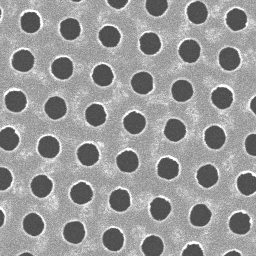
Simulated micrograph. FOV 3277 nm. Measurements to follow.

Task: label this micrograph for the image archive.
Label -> a regular array of holes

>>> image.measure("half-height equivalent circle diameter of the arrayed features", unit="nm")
290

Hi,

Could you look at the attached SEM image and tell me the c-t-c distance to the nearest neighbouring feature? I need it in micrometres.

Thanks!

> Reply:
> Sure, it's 0.505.